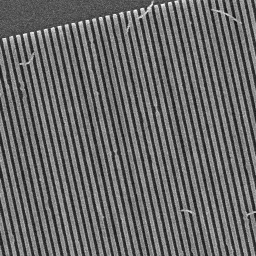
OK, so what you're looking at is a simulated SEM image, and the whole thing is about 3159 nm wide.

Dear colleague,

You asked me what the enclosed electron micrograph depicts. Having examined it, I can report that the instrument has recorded parallel lines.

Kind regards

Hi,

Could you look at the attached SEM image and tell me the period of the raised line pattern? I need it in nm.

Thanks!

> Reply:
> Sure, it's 87.1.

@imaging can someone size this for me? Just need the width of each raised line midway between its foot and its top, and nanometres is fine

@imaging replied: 42.2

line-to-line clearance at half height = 0.0422 microns